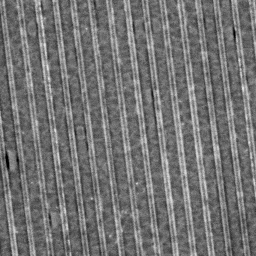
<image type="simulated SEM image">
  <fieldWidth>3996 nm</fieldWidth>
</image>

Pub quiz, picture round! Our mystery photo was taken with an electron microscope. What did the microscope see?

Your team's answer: parallel lines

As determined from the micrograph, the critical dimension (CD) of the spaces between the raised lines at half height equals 207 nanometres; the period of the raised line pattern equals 277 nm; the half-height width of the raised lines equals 73.5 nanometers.